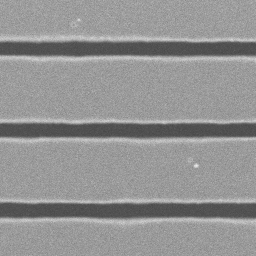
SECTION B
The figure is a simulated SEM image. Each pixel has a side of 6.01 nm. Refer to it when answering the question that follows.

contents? lines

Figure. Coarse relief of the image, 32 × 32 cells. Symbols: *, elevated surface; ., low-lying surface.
********************************
********************************
********************************
********************************
********************************
................................
................................
********************************
********************************
********************************
********************************
********************************
********************************
********************************
********************************
................................
................................
********************************
********************************
********************************
********************************
********************************
********************************
********************************
********************************
................................
................................
********************************
********************************
********************************
********************************
********************************